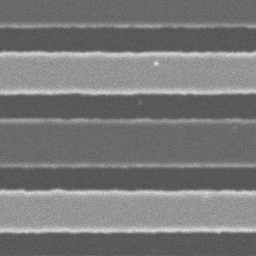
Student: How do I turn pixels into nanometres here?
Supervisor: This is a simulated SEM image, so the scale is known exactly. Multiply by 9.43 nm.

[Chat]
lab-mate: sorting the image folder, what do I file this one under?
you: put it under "lines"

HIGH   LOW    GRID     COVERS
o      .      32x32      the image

oooooooooooooooooooooooooooooooo
oooooooooooooooooooooooooooooooo
oooooooooooooooooooooooooooooooo
................................
................................
................................
.o..o...........................
oooooooooooooooooooooooooooooooo
oooooooooooooooooooooooooooooooo
oooooooooooooooooooooooooooooooo
oooooooooooooooooooooooooooooooo
oooooooooooooooooooooooooooooooo
................................
................................
................................
oooooooooooooooooooooooooooooooo
oooooooooooooooooooooooooooooooo
oooooooooooooooooooooooooooooooo
oooooooooooooooooooooooooooooooo
oooooooooooooooooooooooooooooooo
oooooooooooooooooooooooooooooooo
................................
................................
................................
oooooooooooooooooooooooooooooooo
oooooooooooooooooooooooooooooooo
oooooooooooooooooooooooooooooooo
oooooooooooooooooooooooooooooooo
oooooooooooooooooooooooooooooooo
................................
................................
................................